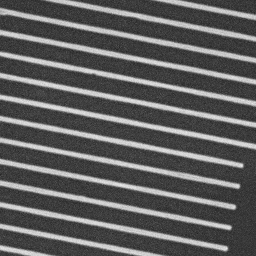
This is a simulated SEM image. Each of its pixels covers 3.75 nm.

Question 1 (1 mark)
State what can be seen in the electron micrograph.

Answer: parallel lines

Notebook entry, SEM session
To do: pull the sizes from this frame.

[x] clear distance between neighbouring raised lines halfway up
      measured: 64.5 nanometers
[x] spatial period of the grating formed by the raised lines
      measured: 79.4 nanometres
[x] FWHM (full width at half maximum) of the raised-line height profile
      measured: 14.2 nm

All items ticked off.